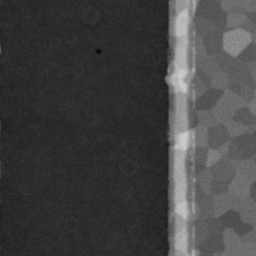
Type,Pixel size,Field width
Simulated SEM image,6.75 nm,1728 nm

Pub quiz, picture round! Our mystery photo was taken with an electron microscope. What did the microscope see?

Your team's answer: one or a few lines or trenches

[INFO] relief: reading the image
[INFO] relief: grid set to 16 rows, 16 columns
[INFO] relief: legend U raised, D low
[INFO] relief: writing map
DDDDDDDDDDDUUUUU
DDDDDDDDDDDUUUUU
DDDDDDDDDDDUUUUU
DDDDDDDDDDDUUUUU
DDDDDDDDDDDUUUUU
DDDDDDDDDDDUUUUU
DDDDDDDDDDDUUUUU
DDDDDDDDDDDUUUUU
DDDDDDDDDDDUUUUU
DDDDDDDDDDDUUUUU
DDDDDDDDDDDUUUUU
DDDDDDDDDDDUUUUU
DDDDDDDDDDDUUUUU
DDDDDDDDDDDUUUUU
DDDDDDDDDDDUUUUU
DDDDDDDDDDDUUUUU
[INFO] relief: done